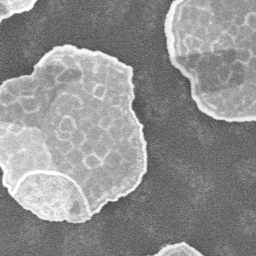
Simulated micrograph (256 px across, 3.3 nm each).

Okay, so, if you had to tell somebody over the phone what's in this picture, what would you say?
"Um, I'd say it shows raised bodies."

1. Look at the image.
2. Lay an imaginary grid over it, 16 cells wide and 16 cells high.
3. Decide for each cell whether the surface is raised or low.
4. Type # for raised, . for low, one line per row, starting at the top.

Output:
##.........#####
...........#####
...........#####
...####....#####
..######....####
########....####
########....####
#########.......
#########.......
#########.......
#########.......
#....####.......
.....##.........
................
................
...........#....